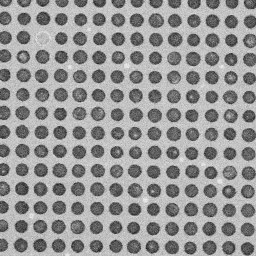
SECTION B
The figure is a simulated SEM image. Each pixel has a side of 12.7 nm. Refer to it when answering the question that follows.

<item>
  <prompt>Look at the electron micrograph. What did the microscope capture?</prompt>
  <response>a regular array of holes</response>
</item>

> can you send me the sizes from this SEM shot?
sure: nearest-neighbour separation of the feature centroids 235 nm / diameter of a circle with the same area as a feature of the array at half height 176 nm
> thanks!